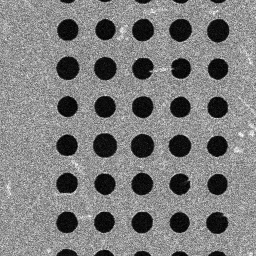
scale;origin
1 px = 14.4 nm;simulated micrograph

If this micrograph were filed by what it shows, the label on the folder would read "a regular array of holes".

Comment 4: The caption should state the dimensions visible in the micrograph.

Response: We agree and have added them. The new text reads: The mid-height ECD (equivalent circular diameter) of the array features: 313 nanometres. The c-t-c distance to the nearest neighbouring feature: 541 nm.